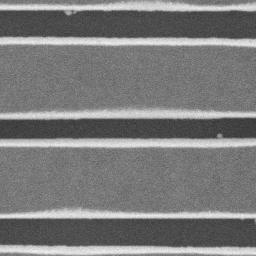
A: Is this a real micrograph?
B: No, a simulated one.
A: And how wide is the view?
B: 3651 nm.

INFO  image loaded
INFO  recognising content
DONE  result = lines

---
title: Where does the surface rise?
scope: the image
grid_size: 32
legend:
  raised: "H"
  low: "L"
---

HHHHHHHHHHHHHHHHHHHHHHHHHHHHHHHH
LLLLLLLLLLLLLLLLLLLLLLLLLLLLLLLL
LLLLLLLLLLLLLLLLLLLLLLLLLLLLLLLL
LLLLLLLLLLLLLLLLLLLLLLLLLLLLLLLL
LLLLLLLLLLLLLLLLLLLLLLLLLLLLLLLL
HHHHHHHHHHHHHHHHHHHHHHHHHHHHHHHH
HHHHHHHHHHHHHHHHHHHHHHHHHHHHHHHH
HHHHHHHHHHHHHHHHHHHHHHHHHHHHHHHH
HHHHHHHHHHHHHHHHHHHHHHHHHHHHHHHH
HHHHHHHHHHHHHHHHHHHHHHHHHHHHHHHH
HHHHHHHHHHHHHHHHHHHHHHHHHHHHHHHH
HHHHHHHHHHHHHHHHHHHHHHHHHHHHHHHH
HHHHHHHHHHHHHHHHHHHHHHHHHHHHHHHH
HHHHHHHHHHHHHHHHHHHHHHHHHHHHHHHH
HHHHHHHHHHHHHHHHHHHHHHHHHHHHHHHH
LLLLLLLLLLLLLLLLLLLLLLLLLLLLLLLL
LLLLLLLLLLLLLLLLLLLLLLLLLLLLLLLL
LLLLLLLLLLLLLLLLLLLLLLLLLLLLLLLL
HHHHHHHHHHHHHHHHHHHHHHHHHHHHHHHH
HHHHHHHHHHHHHHHHHHHHHHHHHHHHHHHH
HHHHHHHHHHHHHHHHHHHHHHHHHHHHHHHH
HHHHHHHHHHHHHHHHHHHHHHHHHHHHHHHH
HHHHHHHHHHHHHHHHHHHHHHHHHHHHHHHH
HHHHHHHHHHHHHHHHHHHHHHHHHHHHHHHH
HHHHHHHHHHHHHHHHHHHHHHHHHHHHHHHH
HHHHHHHHHHHHHHHHHHHHHHHHHHHHHHHH
HHHHHHHHHHHHHHHHHHHHHHHHHHHHHHHH
LLLLLLLLLLLLLLLLLLLLLLLLLLLLLLLL
LLLLLLLLLLLLLLLLLLLLLLLLLLLLLLLL
LLLLLLLLLLLLLLLLLLLLLLLLLLLLLLLL
LLLLLLLLLLLLLLLLLLLLLLLLLLLLLLLL
HHHHHHHHHHHHHHHHHHHHHHHHHHHHHHHH